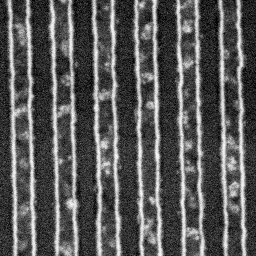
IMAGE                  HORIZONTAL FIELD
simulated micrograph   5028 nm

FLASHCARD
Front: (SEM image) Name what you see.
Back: parallel lines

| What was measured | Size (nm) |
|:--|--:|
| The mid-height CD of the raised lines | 348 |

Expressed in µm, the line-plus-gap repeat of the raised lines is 0.826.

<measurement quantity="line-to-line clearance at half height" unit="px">24.6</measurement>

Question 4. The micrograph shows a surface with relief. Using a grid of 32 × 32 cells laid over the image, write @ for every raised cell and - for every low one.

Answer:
-@@---@@@---@@---@@---@@----@@--
-@@----@@---@@---@@---@@@---@@--
-@@----@@---@@---@@---@@@---@@--
-@@----@@---@@---@@---@@@---@@--
-@@@---@@---@@---@@---@@@---@@--
-@@@---@@---@@---@@---@@@---@@--
-@@@---@@---@@---@@---@@@---@@--
-@@@---@@---@@---@@----@@---@@--
-@@@---@@---@@---@@----@@---@@--
--@@---@@---@@---@@----@@---@@--
--@@---@@---@@---@@@---@@---@@--
--@@---@@---@@---@@@---@@---@@--
--@@---@@---@@----@----@@---@@--
--@@---@@---@@---@@----@@---@@--
--@@---@@---@@---@@----@@---@@--
--@@---@@---@@---@@@---@@---@@--
--@@---@@---@@---@@@---@@---@@--
--@@---@@---@@---@@@---@@---@@--
--@@---@@---@@---@@@---@@---@@--
--@@---@@---@@---@@@---@@---@@--
--@@---@@---@@----@@---@@---@@--
--@@---@@---@@----@@---@@---@@--
--@@---@@---@@----@@---@@---@@--
--@@---@@---@@@---@@---@@---@@--
--@@---@@----@@---@@---@@---@@--
--@@---@@----@@---@@---@@---@@--
--@@---@@---@@@---@@---@@---@@--
--@@---@@---@@@---@@---@@---@@--
--@@---@@---@@@---@@---@@---@@--
--@@---@@---@@@---@@---@@---@@--
--@@---@@@--@@@---@@---@@---@@--
--@@---@@---@@@---@@---@@---@@--